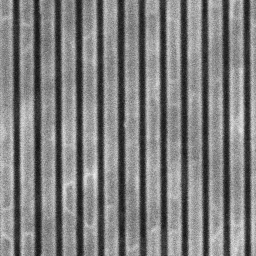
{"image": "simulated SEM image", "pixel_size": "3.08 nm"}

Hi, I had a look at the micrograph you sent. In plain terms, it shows parallel lines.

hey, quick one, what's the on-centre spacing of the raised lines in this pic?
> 64.5 nm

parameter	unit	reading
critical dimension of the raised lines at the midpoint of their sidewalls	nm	41.9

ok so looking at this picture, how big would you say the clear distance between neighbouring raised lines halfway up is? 22.3 nm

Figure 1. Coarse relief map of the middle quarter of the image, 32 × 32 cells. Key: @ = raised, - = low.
@@@--@@@--@@@--@@@@--@@@--@@@--@
@@@--@@@--@@@--@@@@--@@@--@@@--@
@@@--@@@--@@@--@@@@--@@@--@@@--@
@@@--@@@--@@@--@@@@--@@@--@@@--@
@@@--@@@--@@@--@@@@--@@@--@@@--@
@@@--@@@--@@@--@@@@--@@@--@@@--@
@@@--@@@--@@@--@@@@--@@@--@@@--@
@@@--@@@--@@@--@@@@--@@@--@@@--@
@@@--@@@--@@@--@@@@--@@@--@@@--@
@@@--@@@--@@@--@@@@--@@@--@@@--@
@@@--@@@--@@@--@@@@--@@@--@@@--@
@@@--@@@--@@@--@@@@--@@@--@@@--@
@@@--@@@--@@@--@@@@--@@@--@@@--@
@@@--@@@--@@@--@@@@--@@@--@@@--@
@@@--@@@--@@@--@@@@--@@@--@@@--@
@@@--@@@--@@@--@@@@--@@@--@@@--@
@@@--@@@--@@@--@@@@--@@@--@@@--@
@@@--@@@--@@@--@@@@--@@@--@@@--@
@@@--@@@--@@@--@@@@--@@@--@@@--@
@@@--@@@--@@@--@@@@--@@@--@@@--@
@@@--@@@--@@@--@@@@--@@@--@@@--@
@@@--@@@--@@@--@@@@--@@@--@@@--@
@@@--@@@--@@@--@@@@--@@@--@@@--@
@@@--@@@--@@@--@@@@--@@@--@@@--@
@@@--@@@--@@@--@@@@--@@@--@@@--@
@@@--@@@--@@@--@@@@--@@@--@@@--@
@@@--@@@--@@@--@@@@--@@@--@@@--@
@@@--@@@--@@@--@@@@--@@@--@@@--@
@@@--@@@--@@@--@@@@--@@@--@@@--@
@@@--@@@--@@@---@@@--@@@--@@@--@
@@@--@@@--@@@---@@@--@@@--@@@--@
@@@--@@@--@@@---@@@--@@@--@@@--@